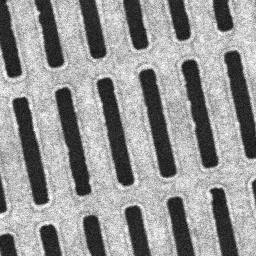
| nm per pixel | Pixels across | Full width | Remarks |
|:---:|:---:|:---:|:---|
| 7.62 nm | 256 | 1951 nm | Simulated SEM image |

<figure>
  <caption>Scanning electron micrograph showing holes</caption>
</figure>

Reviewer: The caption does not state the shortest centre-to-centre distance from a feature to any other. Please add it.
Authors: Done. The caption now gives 0.329 microns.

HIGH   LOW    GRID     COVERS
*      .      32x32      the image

.***..****..***...***..****..***
.****..***..****..***..****..***
.****..***..****..***...***..***
.****..****..***..****..***..***
..***..****..***..****..********
..***...***..****..*************
..****..***..***************..**
...***..********************..**
*..********************..***..**
*.***************..****..****..*
************..****..***..****..*
*******..***..****..***..****..*
**.****..****..***..****..***..*
**..***..****..***..****..***..*
**..***...***..***...***..****..
**..****..***..****..***..****..
**..****..***..****..***...***..
***..***..****..***..****..***..
***..***..****..***..****..***..
***..****..***..****..***..****.
***..****..***..****..***..*****
***...***..***...***..**********
****..***..****..***************
****..***..****************.****
.***..********************..****
.****.***************..***..****
.***************..***..****..***
**********..****..***..****..***
*****..***...***..***...***..***
.****..****..***..****..***..***
..***..****..***...***..***...**
..***...***..****..***..****..**